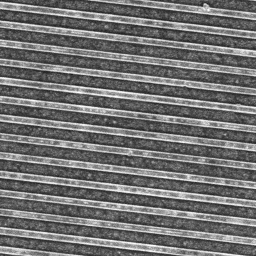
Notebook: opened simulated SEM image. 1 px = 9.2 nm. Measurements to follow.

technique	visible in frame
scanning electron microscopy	parallel lines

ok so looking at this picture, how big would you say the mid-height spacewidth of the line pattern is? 114 nm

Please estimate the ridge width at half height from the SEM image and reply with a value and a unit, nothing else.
52.5 nm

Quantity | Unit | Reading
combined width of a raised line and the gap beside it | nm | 172